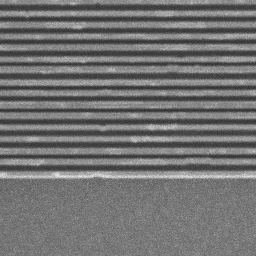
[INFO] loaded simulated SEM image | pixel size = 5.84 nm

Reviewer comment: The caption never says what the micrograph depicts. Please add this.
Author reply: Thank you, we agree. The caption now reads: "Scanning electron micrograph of parallel lines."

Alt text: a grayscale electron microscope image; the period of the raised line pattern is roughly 67.1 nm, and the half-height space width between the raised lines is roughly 0.0387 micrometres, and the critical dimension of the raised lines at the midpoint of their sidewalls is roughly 33.6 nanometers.